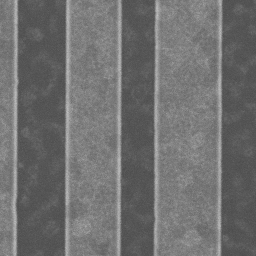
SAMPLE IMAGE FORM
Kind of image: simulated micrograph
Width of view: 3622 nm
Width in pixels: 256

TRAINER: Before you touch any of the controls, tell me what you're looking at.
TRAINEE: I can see one or a few lines or trenches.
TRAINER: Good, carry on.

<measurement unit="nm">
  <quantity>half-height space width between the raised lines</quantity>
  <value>645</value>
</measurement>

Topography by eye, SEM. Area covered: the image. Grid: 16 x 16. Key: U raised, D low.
UDDDUUUDDDUUUUDD
UDDDUUUDDDUUUUDD
UDDDUUUDDDUUUUDD
UDDDUUUDDDUUUUDD
UDDDUUUDDDUUUUDD
UDDDUUUDDDUUUUDD
UDDDUUUDDDUUUUDD
UDDDUUUDDDUUUUDD
UDDDUUUDDDUUUUDD
UDDDUUUDDDUUUUDD
UDDDUUUDDDUUUUDD
UDDDUUUDDDUUUUDD
UDDDUUUDDDUUUUDD
UDDDUUUDDDUUUUDD
UDDDUUUDDDUUUUDD
UDDDUUUDDDUUUUDD